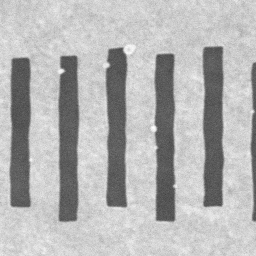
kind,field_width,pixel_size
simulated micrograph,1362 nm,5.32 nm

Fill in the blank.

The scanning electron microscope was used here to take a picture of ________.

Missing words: groups of lines, slits or small figures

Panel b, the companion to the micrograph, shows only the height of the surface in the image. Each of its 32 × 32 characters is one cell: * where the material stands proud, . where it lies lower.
********************************
********************************
********************************
********************************
********************************
********************************
*************...*********...****
**..***...***...***...***...****
*...****..***...***...***...***.
*...***...***...***...***...***.
*...***...***...***...***...***.
*...***...***...***...***...***.
*...***...***...***...***...***.
*...***...***...***...***...****
*...***...***...***...***...***.
*...***...***...***...***...***.
*...***...***...***...***...***.
*...***...***...***...***...***.
*...***...***...***...****..***.
*...***...***...***...****..***.
*...***...***...***...***...***.
*...***...***...***...***...***.
*...***...***...***...***...***.
*...***...***...***...***...***.
*...***...***...***...***...***.
*...***...***...***...***...***.
*******...*********...*********.
*******...**********..**********
********************************
********************************
********************************
********************************